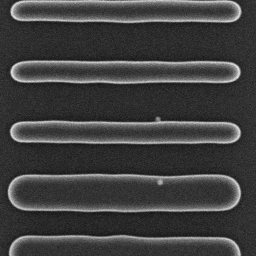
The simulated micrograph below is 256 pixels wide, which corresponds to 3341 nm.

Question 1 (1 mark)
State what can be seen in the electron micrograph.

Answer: groups of lines, slits or small figures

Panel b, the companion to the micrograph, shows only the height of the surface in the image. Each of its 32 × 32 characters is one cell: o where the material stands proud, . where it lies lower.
..ooooooooooooooooooooooooooo...
..oooooooooooooooooooooooooooo..
..oo..ooooooooooooooooooooooo...
................................
................................
................................
................................
................................
..oooooooooooooooooooooooooooo..
..oooooooooooooooooooooooooooo..
................................
................................
................................
................................
................................
..ooooooooooooooooooooooooooo...
.ooooooooooooooooooooooooooooo..
..ooooooooooooooooooooooooooo...
................................
................................
................................
................................
..ooooooooooooooooooooooooooo...
.ooooooooooooooooooooooooooooo..
.ooooooooooooooooooooooooooooo..
..ooooooooooooooooooooooooooo...
................................
................................
................................
..............oo................
..ooooooooooooooooooooooooooo...
.ooooooooooooooooooooooooooooo..